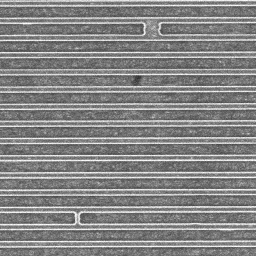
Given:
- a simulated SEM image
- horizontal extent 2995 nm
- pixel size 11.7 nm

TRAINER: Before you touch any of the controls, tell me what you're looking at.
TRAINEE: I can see parallel lines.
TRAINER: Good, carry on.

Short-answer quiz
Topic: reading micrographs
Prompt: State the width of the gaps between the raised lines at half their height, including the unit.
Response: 136 nm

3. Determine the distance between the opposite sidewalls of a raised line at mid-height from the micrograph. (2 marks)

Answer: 67.3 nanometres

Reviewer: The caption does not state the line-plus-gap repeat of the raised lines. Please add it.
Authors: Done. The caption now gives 201 nm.